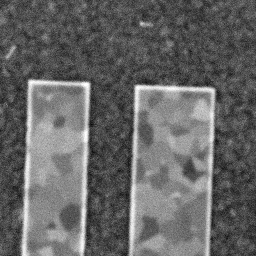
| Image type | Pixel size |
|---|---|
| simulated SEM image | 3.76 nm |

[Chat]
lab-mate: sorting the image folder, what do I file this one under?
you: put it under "one or a few lines or trenches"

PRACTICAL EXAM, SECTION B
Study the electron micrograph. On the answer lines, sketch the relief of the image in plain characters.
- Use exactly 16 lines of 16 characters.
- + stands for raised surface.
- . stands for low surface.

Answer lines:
................
................
................
................
................
..+++....+......
..+++....++++...
..+++...+++++...
..+++...+++++...
..+++...+++++...
..+++...+++++...
..+++...+++++...
..+++...+++++...
..+++...+++++...
..+++...+++++...
.++++...+++++...